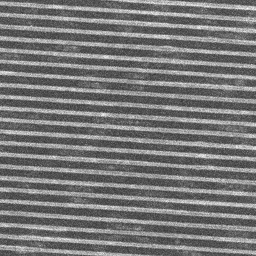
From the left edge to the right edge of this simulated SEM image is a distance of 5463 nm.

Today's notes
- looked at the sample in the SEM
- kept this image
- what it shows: parallel lines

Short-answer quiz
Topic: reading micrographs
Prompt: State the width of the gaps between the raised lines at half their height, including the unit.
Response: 8.36 px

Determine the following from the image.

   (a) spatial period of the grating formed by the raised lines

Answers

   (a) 248 nanometers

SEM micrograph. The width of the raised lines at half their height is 74.5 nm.